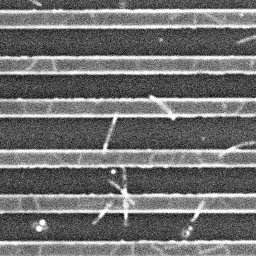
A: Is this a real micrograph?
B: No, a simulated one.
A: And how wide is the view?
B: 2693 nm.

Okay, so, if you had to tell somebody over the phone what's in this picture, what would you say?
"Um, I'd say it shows lines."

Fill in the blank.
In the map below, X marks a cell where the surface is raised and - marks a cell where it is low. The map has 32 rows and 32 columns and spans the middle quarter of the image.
XXXXXXXXXXXXXXXXXXXXXXXXXXXXXXXX
XXXXXXXXXXXXXXXXXXXXXXXXXXXXXXXX
--------------------------------
--------------------------------
--------------------------------
--------------------------------
--------------------------------
--------------------------------
----------------------X---------
XXXXXXXXXXXXXXXXXXXXXXXXXXXXXXXX
XXXXXXXXXXXXXXXXXXXXXXXXXXXXXXXX
XXXXXXXXXXXXXXXXXXXXXXXXXXXXXXXX
XXXXXXXXXXXXXXXXXXXXXXXXXXXXXXXX
------------X--------------X----
--------------------------------
--------------------------------
--------------------------------
--------------------------------
--------------------------------
--------------------------------
--------------------------------
----------X---------------------
XXXXXXXXXXXXXXXXXXXXXXXXXXXXXXXX
XXXXXXXXXXXXXXXXXXXXXXXXXXXXXXXX
XXXXXXXXXXXXXXXXXXXXXXXXXXXXXXXX
-XXXX-X--XX---X----XXX---X-----X
--------------------------------
--------------------------------
--------------------------------
--------------------------------
--------------------------------
--------------------------------